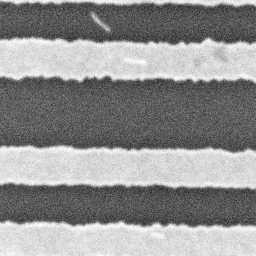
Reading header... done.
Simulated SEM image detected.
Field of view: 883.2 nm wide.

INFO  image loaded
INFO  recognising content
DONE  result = lines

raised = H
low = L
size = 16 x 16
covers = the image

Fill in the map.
LLLLLLLLLLLLLLLL
LLLLLLLLLLLLLLLL
LHHLLLLLLLLLLLLL
HHHHHHHHHHHHHHHH
HHHHHHHHHHHHHHHH
LLLLLLLLLLLLLLLL
LLLLLLLLLLLLLLLL
LLLLLLLLLLLLLLLL
LLLLLLLLLLLLLLLL
HHHHHHHHHHHHHHLH
HHHHHHHHHHHHHHHH
LLLLLLHHHHHHHHHH
LLLLLLLLLLLLLLLL
LLLLLLLLLLLLLLLL
HHHHHHHHHHHHHHHH
HHHHHHHHHHHHHHHH